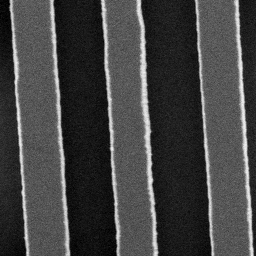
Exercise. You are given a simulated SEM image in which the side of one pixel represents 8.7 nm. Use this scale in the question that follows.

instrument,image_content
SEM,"lines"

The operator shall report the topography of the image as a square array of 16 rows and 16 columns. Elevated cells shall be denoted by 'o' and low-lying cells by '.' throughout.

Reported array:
.oo...ooo...ooo.
.oo...ooo...ooo.
.oo....oo...ooo.
.ooo...oo...ooo.
.ooo...oo....oo.
.ooo...oo....oo.
.ooo...oo....oo.
.ooo...oo....oo.
.ooo...oo....oo.
.ooo...oo....oo.
.ooo...oo....ooo
.ooo...ooo...ooo
.ooo...ooo...ooo
..oo...ooo...ooo
..oo...ooo...ooo
..oo...ooo...ooo